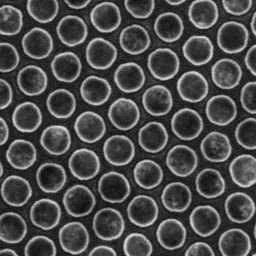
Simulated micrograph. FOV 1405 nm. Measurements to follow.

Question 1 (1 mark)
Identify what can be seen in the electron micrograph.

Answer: a regular array of raised bodies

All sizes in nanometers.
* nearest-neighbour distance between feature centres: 200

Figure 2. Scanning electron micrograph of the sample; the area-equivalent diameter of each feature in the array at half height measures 161 nm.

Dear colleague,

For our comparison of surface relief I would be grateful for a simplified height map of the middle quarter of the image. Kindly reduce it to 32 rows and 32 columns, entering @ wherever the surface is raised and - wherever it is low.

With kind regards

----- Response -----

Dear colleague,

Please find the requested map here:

@@@@---@@@@---@@@@---@@@@@@@----
@@@@---------@@@@@@---@@@@@@----
@@@@---------@@@@@@@--@@@@@@--@@
@@@---@@@----@@@@@@@----@@---@@@
-----@@@@@@--@@@@@@@---------@@@
----@@@@@@@---@@@@@----@----@@@@
----@@@@@@@@---@@@---@@@@@---@@@
@@--@@@@@@@---------@@@@@@---@@@
@@---@@@@@@---------@@@@@@@---@@
@@@---@@@@---@@@@---@@@@@@@-----
@@@---------@@@@@@--@@@@@@@-----
@@---------@@@@@@@---@@@@@---@@@
@@---@@@---@@@@@@@@---@@@---@@@@
----@@@@@--@@@@@@@@--------@@@@@
---@@@@@@@--@@@@@@---------@@@@@
---@@@@@@@---@@@@---@@@@@--@@@@@
@--@@@@@@@---------@@@@@@--@@@@@
@--@@@@@@@---------@@@@@@@--@@@@
@---@@@@@---@@@@---@@@@@@@---@@@
@----------@@@@@@--@@@@@@@------
@---------@@@@@@@--@@@@@@-------
@---@@----@@@@@@@----@@@---@@@@@
--@@@@@@--@@@@@@@---------@@@@@@
--@@@@@@---@@@@@@---------@@@@@@
-@@@@@@@@--@@@@@---@@@----@@@@@@
-@@@@@@@@---------@@@@@@--@@@@@@
--@@@@@@----------@@@@@@---@@@@@
--@@@@@@---@@-----@@@@@@----@@@-
----@@@--@@@@@@---@@@@@@--------
---------@@@@@@@--@@@@@@--------
---@-----@@@@@@@---@@@@---@@@@--
-@@@@@---@@@@@@@---------@@@@@@-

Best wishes